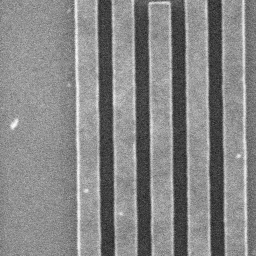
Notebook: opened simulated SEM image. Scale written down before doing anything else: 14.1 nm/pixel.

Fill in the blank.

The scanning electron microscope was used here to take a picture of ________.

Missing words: groups of lines, slits or small figures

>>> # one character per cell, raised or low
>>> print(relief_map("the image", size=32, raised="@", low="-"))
---------@@@--@@@--@@--@@@--@@--
---------@@@--@@@--@@--@@@--@@--
---------@@@--@@@--@@--@@@--@@--
----------@@--@@@--@@--@@@--@@--
---------@@@--@@@--@@--@@@--@@--
----------@@--@@@--@@--@@@--@@--
----------@@--@@@--@@--@@@--@@--
----------@@--@@@--@@--@@@--@@--
----------@@--@@@--@@--@@@--@@--
----------@@--@@@--@@--@@@--@@--
----------@@--@@@--@@--@@@--@@@-
----------@@--@@@--@@--@@@--@@@-
----------@@--@@@--@@--@@@--@@@-
----------@@--@@@--@@--@@@--@@@-
----------@@--@@@--@@--@@@--@@@-
----------@@--@@@--@@--@@@--@@@-
----------@@--@@@--@@--@@@--@@@-
----------@@--@@@--@@--@@@--@@@-
----------@@--@@@--@@--@@@--@@@-
----------@@--@@@--@@--@@@--@@@-
----------@@--@@@--@@---@@--@@@-
----------@@--@@@--@@---@@--@@@-
----------@@--@@@--@@---@@--@@@-
----------@@--@@@--@@@--@@--@@@-
----------@@--@@@--@@@--@@--@@@-
----------@@--@@@--@@@--@@--@@@-
----------@@--@@@--@@@--@@--@@@-
----------@@--@@@--@@@--@@--@@@-
----------@@@-@@@--@@@--@@--@@@-
----------@@@-@@@--@@@--@@--@@@-
----------@@@-@@@--@@@--@@--@@@-
----------@@@-@@@--@@@--@@--@@@-